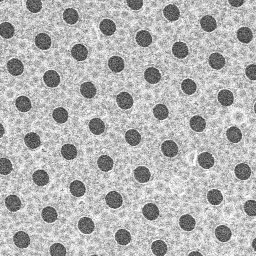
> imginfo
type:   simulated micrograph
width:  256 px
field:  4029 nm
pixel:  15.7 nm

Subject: a regular array of holes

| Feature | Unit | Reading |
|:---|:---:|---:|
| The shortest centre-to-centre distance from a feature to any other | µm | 0.591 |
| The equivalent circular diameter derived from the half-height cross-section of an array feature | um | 0.277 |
